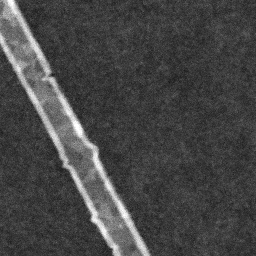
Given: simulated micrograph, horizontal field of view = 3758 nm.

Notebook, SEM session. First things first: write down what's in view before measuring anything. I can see one or a few lines or trenches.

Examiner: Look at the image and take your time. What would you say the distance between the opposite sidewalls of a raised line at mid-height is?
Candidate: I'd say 380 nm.